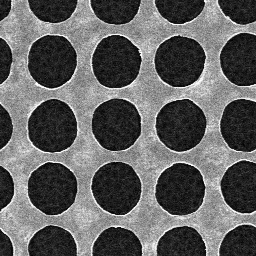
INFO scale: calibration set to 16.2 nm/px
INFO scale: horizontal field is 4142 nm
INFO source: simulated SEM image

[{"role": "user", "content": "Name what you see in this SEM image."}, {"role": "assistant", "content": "a regular array of holes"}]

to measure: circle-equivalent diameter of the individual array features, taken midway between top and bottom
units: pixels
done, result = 51.6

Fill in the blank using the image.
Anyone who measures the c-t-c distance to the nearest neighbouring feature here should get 1030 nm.